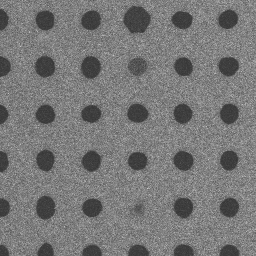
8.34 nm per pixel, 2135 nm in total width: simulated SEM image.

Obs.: a regular array of holes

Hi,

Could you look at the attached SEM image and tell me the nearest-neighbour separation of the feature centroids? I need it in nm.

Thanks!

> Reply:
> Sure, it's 382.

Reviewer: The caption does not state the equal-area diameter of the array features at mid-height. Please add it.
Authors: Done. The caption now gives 0.159 micrometres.